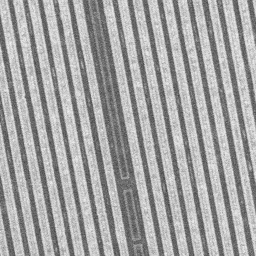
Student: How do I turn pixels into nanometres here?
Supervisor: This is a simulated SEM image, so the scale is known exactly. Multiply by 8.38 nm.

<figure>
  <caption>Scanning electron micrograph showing parallel lines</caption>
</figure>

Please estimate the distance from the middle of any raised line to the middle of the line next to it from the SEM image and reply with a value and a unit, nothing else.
123 nm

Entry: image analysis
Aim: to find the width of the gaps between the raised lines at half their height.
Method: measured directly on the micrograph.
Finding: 64.8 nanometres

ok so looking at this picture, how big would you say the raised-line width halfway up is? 0.0587 um